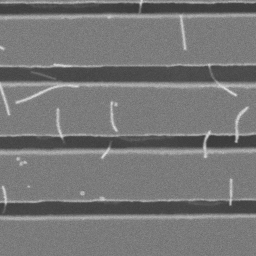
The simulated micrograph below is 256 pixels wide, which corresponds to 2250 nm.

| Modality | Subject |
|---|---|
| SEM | lines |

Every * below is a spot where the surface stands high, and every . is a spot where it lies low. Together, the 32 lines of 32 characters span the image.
.................*..............
................................
********************************
********************************
********************************
********************************
********************************
********************************
................................
................................
********************************
********************************
********************************
********************************
********************************
********************************
********************************
................................
.........................*.....*
********************************
********************************
********************************
********************************
********************************
********************************
................................
................................
********************************
********************************
********************************
********************************
********************************